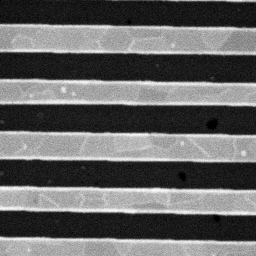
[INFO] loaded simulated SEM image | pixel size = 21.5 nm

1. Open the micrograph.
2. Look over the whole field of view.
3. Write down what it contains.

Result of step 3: lines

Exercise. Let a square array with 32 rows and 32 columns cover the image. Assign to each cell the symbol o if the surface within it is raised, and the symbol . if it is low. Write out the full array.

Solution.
................................
................................
................................
oooooooooooooooooooooooooooooo..
oooooooooooooooooooooooooooooooo
oooooooooooooooooooooooooooooooo
.......o.ooooooooooooooooooooooo
................................
................................
................................
oooooooooooooooooooooooooooooooo
oooooooooooooooooooooooooooooooo
oooooooooooooooooooooooooooooooo
................................
................................
................................
................................
oooooooooooooooooooooooooooooooo
oooooooooooooooooooooooooooooooo
oooooooooooooooooooooooooooooooo
................................
................................
................................
oooooooooo......................
oooooooooooooooooooooooooooooooo
oooooooooooooooooooooooooooooooo
.................ooooooooooooooo
................................
................................
................................
oooooooooooooooooooooooooooooooo
oooooooooooooooooooooooooooooooo